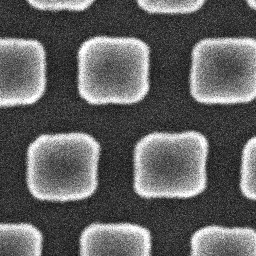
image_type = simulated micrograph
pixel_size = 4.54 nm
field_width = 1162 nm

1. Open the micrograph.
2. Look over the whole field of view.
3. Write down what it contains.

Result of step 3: raised bodies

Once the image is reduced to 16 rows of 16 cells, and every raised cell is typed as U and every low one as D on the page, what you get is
DDDDUDDDDUUUDDDD
DDDDDDDDDDDDDDDD
DDDDDDUUDDDDDUUD
UUUDDUUUUDDDUUUU
UUUDDUUUUDDDUUUU
UUUDDUUUUDDDUUUU
DDDDDDDDDDDDDDDD
DDDDDDDDDDDDDDDD
DDDDUDDDDDUUDDDD
DDUUUUDDDUUUUDDU
DDUUUUDDDUUUUDDU
DDUUUUDDDUUUUDDU
DDDDDDDDDDDDDDDD
DDDDDDDDDDDDDDDD
UUDDDUUUUDDDDUUU
UUDDDUUUUDDDUUUU